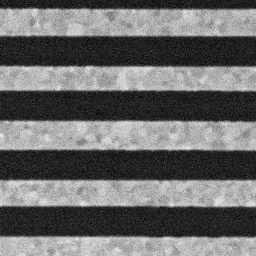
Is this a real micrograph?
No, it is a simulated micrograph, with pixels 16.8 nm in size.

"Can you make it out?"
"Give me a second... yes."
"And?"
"lines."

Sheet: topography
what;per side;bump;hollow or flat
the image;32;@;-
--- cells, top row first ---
--------------------------------
@@@@@@@@@@@@@@@@@@@@@@@@@@@@@@@@
@@@@@@@@@@@@@@@@@@@@@@@@@@@@@@@@
@@@@@@@@@@@@@@@@@@@@@@@@@@@@@@@@
--------------------------------
--------------------------------
--------------------------------
--------------------------------
@@@@@@@@@@@@@@@@@@@@@@@@@-@@@@-@
@@@@@@@@@@@@@@@@@@@@@@@@@@@@@@@@
@@@@@@@@@@@@@@@@@@@@@@@@@@@@@@@@
--------------------------------
--------------------------------
--------------------------------
--------------------------------
@@@@@@@@@@@@@@@@@@@@@@@@@@@@@@@@
@@@@@@@@@@@@@@@@@@@@@@@@@@@@@@@@
@@@@@@@@@@@@@@@@@@@@@@@@@@@@@@@@
@@@@@@@@@@@@@@@@@@@@@@@@@@@@@@@@
--------------------------------
--------------------------------
--------------------------------
--------------------------------
@@@@@@@@@@@@@@@@@@@@@@@@@@@@@@@@
@@@@@@@@@@@@@@@@@@@@@@@@@@@@@@@@
@@@@@@@@@@@@@@@@@@@@@@@@@@@@@@@@
--------------------------------
--------------------------------
--------------------------------
--------------------------------
@@@@@@@@@@@@@@@@@@@@@@@@@@@@@@@@
@@@@@@@@@@@@@@@@@@@@@@@@@@@@@@@@